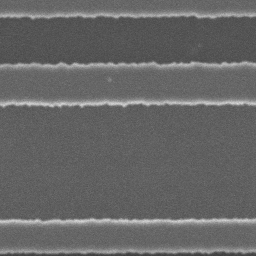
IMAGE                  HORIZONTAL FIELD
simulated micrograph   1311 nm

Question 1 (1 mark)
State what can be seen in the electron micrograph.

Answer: lines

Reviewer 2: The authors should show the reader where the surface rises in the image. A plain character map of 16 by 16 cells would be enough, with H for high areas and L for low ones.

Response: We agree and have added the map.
HHHHHHHHHHHHHHHH
LLLLLLLLLLLLLLLL
LLLLLLLLLLLLLLLL
LLLLLLLLLLLLLLLL
HHHHHHHHHHHHHHHH
HHHHHHHHHHHHHHHH
HHHHHHHHLHHHHHHH
LLLLLLLLLLLLLLLL
LLLLLLLLLLLLLLLL
LLLLLLLLLLLLLLLL
LLLLLLLLLLLLLLLL
LLLLLLLLLLLLLLLL
LLLLLLLLLLLLLLLL
LLLLLLLLLLLLLLLL
HHHHHHHHHHHHHHHH
HHHHHHHHHHHHHHHH